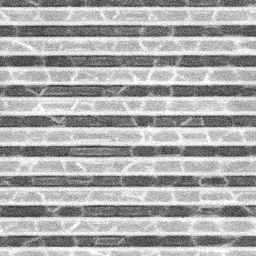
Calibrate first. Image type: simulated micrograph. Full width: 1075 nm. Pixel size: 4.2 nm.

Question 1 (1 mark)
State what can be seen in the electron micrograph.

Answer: parallel lines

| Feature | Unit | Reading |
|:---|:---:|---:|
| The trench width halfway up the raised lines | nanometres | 64.1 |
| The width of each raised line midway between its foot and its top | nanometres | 64.1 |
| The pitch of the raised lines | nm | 126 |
